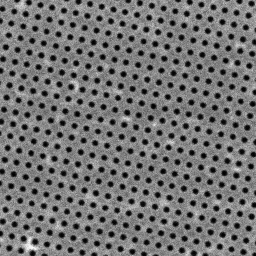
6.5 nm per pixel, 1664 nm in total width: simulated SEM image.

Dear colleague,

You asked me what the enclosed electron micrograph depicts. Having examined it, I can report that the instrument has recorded a regular array of holes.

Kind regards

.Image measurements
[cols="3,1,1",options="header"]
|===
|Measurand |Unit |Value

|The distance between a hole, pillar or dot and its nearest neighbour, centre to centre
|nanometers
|77.4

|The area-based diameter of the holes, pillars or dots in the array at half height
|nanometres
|40.2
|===